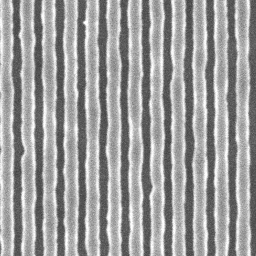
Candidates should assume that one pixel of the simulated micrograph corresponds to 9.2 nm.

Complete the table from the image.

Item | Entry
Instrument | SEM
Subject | parallel lines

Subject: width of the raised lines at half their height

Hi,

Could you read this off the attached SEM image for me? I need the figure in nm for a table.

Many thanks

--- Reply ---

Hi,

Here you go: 112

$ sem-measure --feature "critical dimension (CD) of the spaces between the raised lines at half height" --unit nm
87.4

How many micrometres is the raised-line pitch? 0.198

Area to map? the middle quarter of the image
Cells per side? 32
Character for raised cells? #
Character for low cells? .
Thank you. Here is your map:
###...###..###...##...##....##..
###...###..###..####..##....##..
###...###..###..####..##...###..
###...###..###..###...##...###..
###...###..###..###...##...###..
###...###..###..###...##...###..
###...###..###..###...###..###..
###...###..###..###...###..###..
###...##...###..###...##...###..
###...###..###..###...##...###..
###...###..###..###...###..###..
###...###..###..###...###..###..
###...###..###..###...###..###..
###...###..###..###...###..###..
###...###..###...##...###..###..
###...###..###...##...###..###..
###...###..###...##...###..###..
###...###..###...##...###..###..
###...###..###...##...###..###..
###...##...###...##...###..###..
###...###..###...###..###..###..
###...###..###..####..###..###..
###...##...###..####..###..###..
###...##...###..####..###..###..
###..###...###...##...##...###..
###...###..###...##...###..###..
###...###..###..###...###..###..
###...##...###..###...###..###..
###...##...###..###...###..###..
.##...##...###..###...###..###..
.##...##...###..###...###..###..
###...###..###...##...###..###..